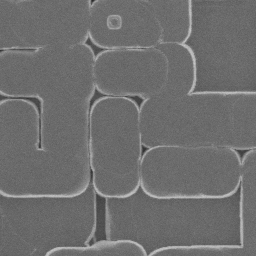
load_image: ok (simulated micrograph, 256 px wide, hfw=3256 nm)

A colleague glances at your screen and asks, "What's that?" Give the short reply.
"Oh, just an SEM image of wiring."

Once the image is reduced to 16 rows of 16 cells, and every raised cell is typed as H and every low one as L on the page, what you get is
HHHHHHHHHHHHLLLL
HHHHHHHHHHHHLLLL
HHHHHHHHHHHHLLLL
HHHHHHHHHHHHLLLL
HHHHHHHHHHHHLLLL
HHHHHHHHHHHHLLLL
HHHHHHHHHHHHHHHH
HHHHHHHHHHHHHHHH
HHHHHHHHHHHHHHHH
HHHHHHHHHHHHHHHH
HHHHHHHHHHHHHHHH
HHHHHHHHHHHHHHHH
LLLLLLLLLLLLLLLH
LLLLLLLLLLLLLLLH
LLLLLLLLLLLLLLLH
LLLLLHHHHLHHHHHH